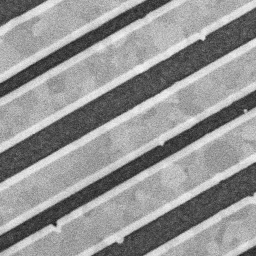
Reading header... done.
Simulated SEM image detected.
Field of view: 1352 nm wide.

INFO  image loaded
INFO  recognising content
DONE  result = one or a few lines or trenches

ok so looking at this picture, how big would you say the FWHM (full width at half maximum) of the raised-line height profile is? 219 nanometers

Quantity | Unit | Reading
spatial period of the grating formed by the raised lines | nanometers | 352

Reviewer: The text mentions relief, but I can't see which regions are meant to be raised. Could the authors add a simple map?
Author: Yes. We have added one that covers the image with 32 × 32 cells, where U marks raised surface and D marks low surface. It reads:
DDDDDDUUUUUUUUUUDDDDDUUUUUUUUUUU
DDDDUUUUUUUUUUUDDDDDUUUUUUUUUUDD
DDUUUUUUUUUUUDDDDDUUUUUUUUUUDDDD
UUUUUUUUUUUDDDDDUUUUUUUUUUUDDDDD
UUUUUUUUUDDDDDUUUUUUUUUUUDDDDDDD
UUUUUUUUDDDDDUUUUUUUUUUDDDDDDDDU
UUUUUUDDDDDUUUUUUUUUUDDDDDDDDDUU
UUUUDDDDDUUUUUUUUUUUDDDDDDDDUUUU
UUUDDDDUUUUUUUUUUUDDDDDDDDUUUUUU
UDDDDDUUUUUUUUUUDDDDDDDDUUUUUUUU
DDDDUUUUUUUUUUDDDDDDDDUUUUUUUUUU
DDUUUUUUUUUUUDDDDDDDDUUUUUUUUUUD
UUUUUUUUUUUDDDDDDDDUUUUUUUUUUDDD
UUUUUUUUUDDDDDDDDUUUUUUUUUUDDDDD
UUUUUUUDDDDDDDDDUUUUUUUUUDDDDDDU
UUUUUUDDDDDDDDUUUUUUUUUUDDDDDUUU
UUUUDDDDDDDDUUUUUUUUUUDDDDDUUUUU
UUDDDDDDDDUUUUUUUUUUDDDDDUUUUUUU
DDDDDDDDUUUUUUUUUUDDDDDDUUUUUUUU
DDDDDDDUUUUUUUUUUDDDDDUUUUUUUUUU
DDDDDUUUUUUUUUUDDDDDUUUUUUUUUUUD
DDDUUUUUUUUUUDDDDDUUUUUUUUUUUDDD
DUUUUUUUUUUDDDDDDUUUUUUUUUUDDDDD
UUUUUUUUUUDDDDDUUUUUUUUUUDDDDDDD
UUUUUUUUDDDDDUUUUUUUUUUUDDDDDDDD
UUUUUUDDDDDUUUUUUUUUUUDDDDDDDDUU
UUUUDDDDDDUUUUUUUUUUDDDDDDDDUUUU
UUUDDDDDUUUUUUUUUUDDDDDDDDUUUUUU
UDDDDDUUUUUUUUUUUDDDDDDDDUUUUUUU
DDDDUUUUUUUUUUUDDDDDDDDUUUUUUUUU
DDDUUUUUUUUUUDDDDDDDDUUUUUUUUUUD
DUUUUUUUUUUDDDDDDDDUUUUUUUUUUUDD